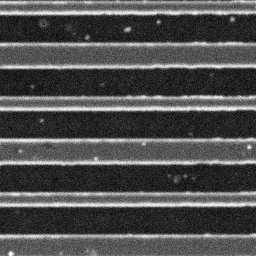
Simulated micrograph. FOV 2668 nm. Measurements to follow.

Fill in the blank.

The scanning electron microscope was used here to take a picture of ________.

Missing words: lines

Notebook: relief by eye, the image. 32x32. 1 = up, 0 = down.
11111111111111111111111111111111
11111111111111111111111111111111
00000000000000000000000000000000
00000000000000000000000000000000
00000000000000000000000000000000
11111111111111111111111111111111
11111111111111111111111111111111
11111111111111111111111111111111
00000000000000000000000000000000
00000000000000000000000000000000
00000000000000000000000000000000
00000000000000000000000000000000
11111111111111111111111111111111
11111111111111111111111111111111
00000000000000000000000000000000
00000000000000000000000000000000
00000000000000000000000000000000
11111111111111111111111111111111
11111111111111111111111111111111
11111111111111111111111111111111
00000000000000000000000000000000
00000000000000000000000000000000
00000000000000000000000000000000
00000000000000000000000000000000
11111111111111111111111111111111
11111111111111111111111111111111
00000000000000000000000000000000
00000000000000000000000000000000
00000000000000000000000000000000
11111111111111111111111111111111
11111111111111111111111111111111
11111111111111111111111111111111